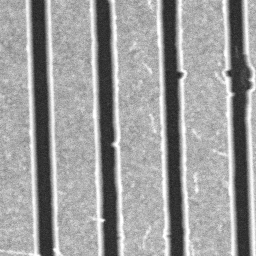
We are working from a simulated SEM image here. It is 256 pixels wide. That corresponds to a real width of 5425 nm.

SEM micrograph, one or a few lines or trenches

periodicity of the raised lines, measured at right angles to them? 1400 nm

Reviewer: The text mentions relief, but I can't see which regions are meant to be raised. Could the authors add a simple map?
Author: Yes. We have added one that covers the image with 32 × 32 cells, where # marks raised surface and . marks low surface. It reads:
####..######..######..######...#
####..######..######..######...#
####..######..######..######...#
####..######..######..######...#
####..######..######..######...#
####..######..######..######...#
####..######..######..######...#
####..######..######..#######..#
####..######..######...######..#
####..######..######...#####...#
####..######..######..#######..#
####..######..######...######..#
####..######..######...######..#
####..######..######...######..#
####..######..#######..######..#
####..######..#######..######..#
####..######...######..######..#
####...#####...######..######..#
####...#####..#######..######..#
####..######...######..######..#
####...#####...######..######..#
####...#####...######..######..#
####...#####...######..######..#
####...#####...######..######..#
####...######..######..######..#
####...#####...######..######..#
####...######..######..######..#
#####..######..######..######..#
#####..######..######..######..#
#####..######..######..######...
#####..######..######..######...
#####..######..######..######...